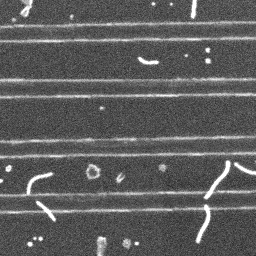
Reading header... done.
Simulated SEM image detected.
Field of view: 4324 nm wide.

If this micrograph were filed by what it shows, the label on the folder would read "lines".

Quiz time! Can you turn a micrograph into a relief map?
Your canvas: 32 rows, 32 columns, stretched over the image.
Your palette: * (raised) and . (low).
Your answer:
................................
................................
................................
********************************
********************************
................................
................................
................................
................................
................................
********************************
********************************
................................
................................
................................
................................
................................
...........*********************
********************************
******..........................
................................
...........*....................
................................
................................
********************************
********************************
*.....*.........................
................................
................................
................................
............*...................
................................